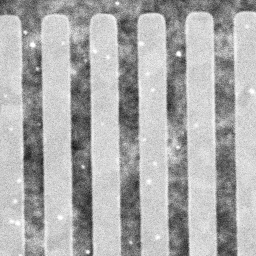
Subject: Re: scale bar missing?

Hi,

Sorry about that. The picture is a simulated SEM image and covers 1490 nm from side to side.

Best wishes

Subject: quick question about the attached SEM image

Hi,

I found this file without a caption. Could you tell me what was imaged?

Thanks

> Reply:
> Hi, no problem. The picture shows groups of lines, slits or small figures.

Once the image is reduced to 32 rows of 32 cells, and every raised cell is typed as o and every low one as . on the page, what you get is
................................
................................
oo...ooo...ooo...ooo...oooo..ooo
ooo..oooo..oooo..oooo...ooo..ooo
ooo..oooo..oooo..oooo..oooo..ooo
ooo..oooo..oooo..oooo..oooo..ooo
ooo..oooo..oooo..oooo..oooo..ooo
ooo..oooo..oooo..oooo..oooo..ooo
ooo..oooo..oooo..oooo..oooo..ooo
ooo..oooo..oooo..oooo..ooo...ooo
ooo..oooo..oooo..oooo..oooo..ooo
ooo..oooo..oooo...ooo..oooo..ooo
ooo..oooo..oooo...ooo..oooo..ooo
ooo..oooo...ooo...ooo..oooo..ooo
ooo..oooo...ooo...ooo..oooo...oo
ooo..oooo...ooo...ooo..oooo...oo
ooo..oooo...ooo...ooo..oooo..ooo
ooo..oooo...ooo...ooo...ooo..ooo
ooo..oooo...ooo...ooo...ooo...oo
oo....ooo...ooo...ooo...ooo...oo
ooo...ooo...ooo...ooo...ooo...oo
ooo...ooo...ooo...ooo...ooo...oo
ooo...ooo...ooo...ooo...ooo...oo
ooo...ooo...ooo....oo...ooo...oo
ooo...ooo...ooo...ooo...ooo...oo
ooo...ooo...ooo...ooo...ooo...oo
ooo...ooo...ooo...ooo...ooo...oo
ooo...ooo...ooo...ooo...ooo...oo
ooo...ooo...ooo...ooo...ooo...oo
ooo...ooo...ooo...ooo...ooo...oo
ooo...ooo...ooo...ooo...ooo...oo
ooo...ooo...ooo...ooo...ooo...oo